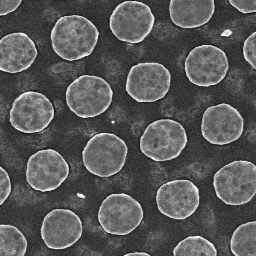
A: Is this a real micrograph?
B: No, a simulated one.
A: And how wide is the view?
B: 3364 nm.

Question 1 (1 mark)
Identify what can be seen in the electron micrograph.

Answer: a regular array of raised bodies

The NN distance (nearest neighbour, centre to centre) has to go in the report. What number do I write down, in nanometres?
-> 786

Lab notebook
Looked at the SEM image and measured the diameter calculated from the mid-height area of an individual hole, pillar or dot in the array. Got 0.552 µm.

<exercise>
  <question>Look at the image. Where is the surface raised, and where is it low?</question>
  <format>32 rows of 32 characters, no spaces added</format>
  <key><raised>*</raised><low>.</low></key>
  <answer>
**.............***...******..***
*.............*****..******...*.
.......****...*****...****......
.......*****..*****.............
.**...******...***.............*
****...*****...................*
*****..****.............****..**
****...................*****...*
***..............****..*****....
..........**....*****...****....
.........****...*****...***.....
........******..*****...........
..****..******...***............
..*****..****.............***...
.******...**.............*****..
.*****.............***...*****..
...*..............*****..*****..
...........****...*****...***...
...........*****..*****.........
....****..******..****..........
...*****...****..............***
*..*****...****............*****
*..*****...................*****
*...***.............****...*****
*.............**....*****..*****
.............****...*****....*..
......***...******..****........
......****..******..............
**...*****...****.............**
***..*****...................***
***...***.............****...***
***...................*****..***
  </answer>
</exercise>